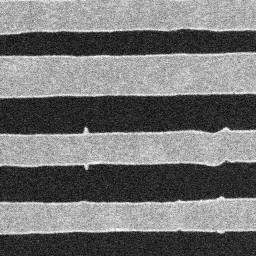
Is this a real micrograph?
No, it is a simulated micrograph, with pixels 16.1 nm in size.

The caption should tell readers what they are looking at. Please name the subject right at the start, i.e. one or a few lines or trenches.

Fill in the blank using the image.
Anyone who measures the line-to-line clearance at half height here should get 0.599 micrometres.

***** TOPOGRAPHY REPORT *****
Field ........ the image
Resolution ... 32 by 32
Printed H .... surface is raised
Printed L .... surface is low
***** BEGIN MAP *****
HHHHHHHHHHHHHHHHHHHHHHHHHHHHHHHH
HHHHHHHHHHHHHHHHHHHHHHHHHHHHHHHH
HHHHHHHHHHHHHHHHHHHHHHHHHHHHHHHH
HHHHHHHHHHHHHHHHHHHHHHHHHHHHHHHH
LLLLLLLLLLLLLLLLLLLLLLLLLLLLLLLL
LLLLLLLLLLLLLLLLLLLLLLLLLLLLLLLL
LLLLLLLLLLLLLLLLLLLLLLLLLLLLLLLL
HHHHHHHHHHHHHHHHHHHHHHHHHHHHHHHH
HHHHHHHHHHHHHHHHHHHHHHHHHHHHHHHH
HHHHHHHHHHHHHHHHHHHHHHHHHHHHHHHH
HHHHHHHHHHHHHHHHHHHHHHHHHHHHHHHH
HHHHHHHHHHHHHHHHHHHHHHHHHHHHHHHH
LLLLLLLLLLLLLLLLLLLLLLLLLLLLLLLL
LLLLLLLLLLLLLLLLLLLLLLLLLLLLLLLL
LLLLLLLLLLLLLLLLLLLLLLLLLLLLLLLL
LLLLLLLLLLLLLLLLLLLLLLLLLLLLLLLL
LLLLLLLLLLHLLLLLLLLLLLHHHLLHHHHH
HHHHHHHHHHHHHHHHHHHHHHHHHHHHHHHH
HHHHHHHHHHHHHHHHHHHHHHHHHHHHHHHH
HHHHHHHHHHHHHHHHHHHHHHHHHHHHHHHH
HHHHHHHHHHHLLLLLLLLLLLLLLLHLLLLL
LLLLLLLLLLLLLLLLLLLLLLLLLLLLLLLL
LLLLLLLLLLLLLLLLLLLLLLLLLLLLLLLL
LLLLLLLLLLLLLLLLLLLLLLLLLLLLLLLL
LLLLLLLLLLLLLLLLLLLLLLLLLLLLLLLL
HHHHHHHHHHHHHHHHHHHHHHHHHHHHHHHH
HHHHHHHHHHHHHHHHHHHHHHHHHHHHHHHH
HHHHHHHHHHHHHHHHHHHHHHHHHHHHHHHH
HHHHHHHHHHHHHHHHHHHHHHHHHHHHHHHH
LLLLLLLLLLLLLLLLLLLLLLLLLLLLLLLL
LLLLLLLLLLLLLLLLLLLLLLLLLLLLLLLL
LLLLLLLLLLLLLLLLLLLLLLLLLLLLLLLL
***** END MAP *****